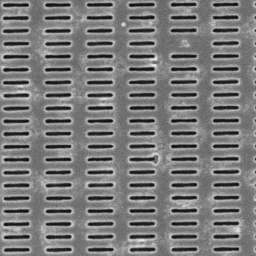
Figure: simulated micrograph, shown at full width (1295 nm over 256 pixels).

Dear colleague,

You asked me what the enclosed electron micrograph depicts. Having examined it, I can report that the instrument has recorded a regular array of holes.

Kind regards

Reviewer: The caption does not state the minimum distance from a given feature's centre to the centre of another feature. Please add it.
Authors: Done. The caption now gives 12.8 pixels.